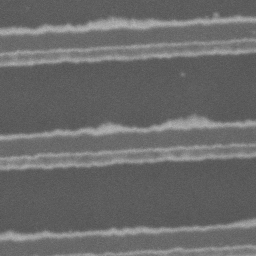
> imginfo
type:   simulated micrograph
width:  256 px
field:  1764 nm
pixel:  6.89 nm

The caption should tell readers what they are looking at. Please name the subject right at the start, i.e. lines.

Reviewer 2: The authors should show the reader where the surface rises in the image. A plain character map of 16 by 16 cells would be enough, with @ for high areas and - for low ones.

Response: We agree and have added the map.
----------------
-----------@@@@@
@@@@@@@@@@@@@@@@
@@@@@@@@@@@-----
----------------
----------------
----------------
----------------
--@@@@@@@@@@@@@@
@@@@@@@@@@@@@@@@
@---------------
----------------
----------------
----------------
--------@@@@@@@@
@@@@@@@@@@@@@@@@